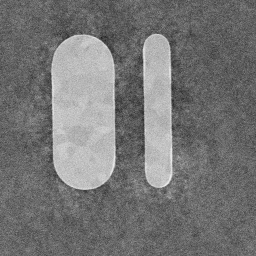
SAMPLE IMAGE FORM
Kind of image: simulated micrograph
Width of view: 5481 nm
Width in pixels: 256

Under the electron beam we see groups of lines, slits or small figures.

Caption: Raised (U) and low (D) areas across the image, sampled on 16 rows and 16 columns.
DDDDDDDDDDDDDDDD
DDDDDDDDDDDDDDDD
DDDDUUDDDUDDDDDD
DDDUUUUDDUUDDDDD
DDDUUUUDDUUDDDDD
DDDUUUUDDUUDDDDD
DDDUUUUDDUUDDDDD
DDDUUUUDDUUDDDDD
DDDUUUUDDUUDDDDD
DDDUUUUDDUUDDDDD
DDDUUUUDDUUDDDDD
DDDDUUDDDDDDDDDD
DDDDDDDDDDDDDDDD
DDDDDDDDDDDDDDDD
DDDDDDDDDDDDDDDD
DDDDDDDDDDDDDDDD